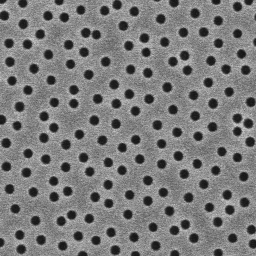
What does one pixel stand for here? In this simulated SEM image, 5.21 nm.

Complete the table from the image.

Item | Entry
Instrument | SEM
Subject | a regular array of holes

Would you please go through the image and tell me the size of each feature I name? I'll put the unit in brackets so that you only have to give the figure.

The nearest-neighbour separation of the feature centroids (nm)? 93.9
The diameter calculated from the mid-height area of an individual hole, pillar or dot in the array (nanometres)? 48.8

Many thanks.